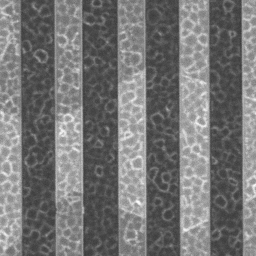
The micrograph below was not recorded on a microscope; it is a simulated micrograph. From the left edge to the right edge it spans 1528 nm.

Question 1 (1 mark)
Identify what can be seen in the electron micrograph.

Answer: one or a few lines or trenches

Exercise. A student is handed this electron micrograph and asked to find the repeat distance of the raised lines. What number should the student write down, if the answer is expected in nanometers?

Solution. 372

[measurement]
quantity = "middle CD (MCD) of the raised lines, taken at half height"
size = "0.16 um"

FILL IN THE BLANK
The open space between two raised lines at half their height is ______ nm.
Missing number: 208